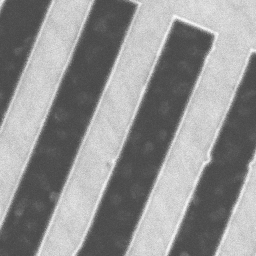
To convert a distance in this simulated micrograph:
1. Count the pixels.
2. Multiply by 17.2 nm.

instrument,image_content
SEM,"one or a few lines or trenches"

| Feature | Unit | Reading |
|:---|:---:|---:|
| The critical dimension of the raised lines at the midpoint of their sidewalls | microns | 0.822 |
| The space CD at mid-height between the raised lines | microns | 0.591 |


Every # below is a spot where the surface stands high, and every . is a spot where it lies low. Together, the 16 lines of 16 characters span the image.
###...###.......
###..###...#....
##...###..###...
##..###...###...
##..###..####..#
#..####..###...#
#..###...###..##
...###..###...##
..###...###..###
..###..####..###
.####..###...###
.###...###..###.
.###..###...###.
###...###..####.
###..####..###..
###..###...###..